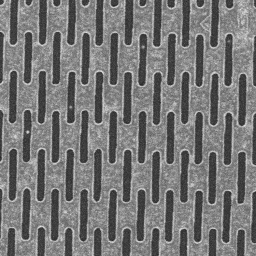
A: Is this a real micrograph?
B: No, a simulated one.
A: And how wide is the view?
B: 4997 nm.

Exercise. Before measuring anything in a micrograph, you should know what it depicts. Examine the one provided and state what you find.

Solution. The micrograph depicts a regular array of holes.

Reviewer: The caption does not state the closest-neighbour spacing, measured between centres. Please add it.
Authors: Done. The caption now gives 556 nm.